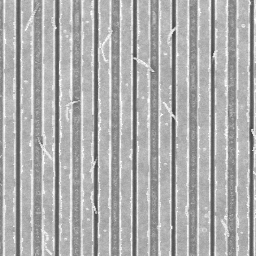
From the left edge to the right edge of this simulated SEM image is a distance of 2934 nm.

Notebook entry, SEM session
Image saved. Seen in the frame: parallel lines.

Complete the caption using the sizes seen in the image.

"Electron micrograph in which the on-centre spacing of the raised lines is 223 nm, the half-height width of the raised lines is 152 nanometers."